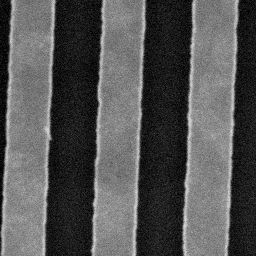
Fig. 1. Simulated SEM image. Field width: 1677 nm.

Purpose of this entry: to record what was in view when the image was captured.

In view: lines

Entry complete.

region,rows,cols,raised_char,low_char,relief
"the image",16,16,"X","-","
-XX---XXX---XXX-
-XX---XXX---XXX-
-XX---XXX---XXX-
-XX---XXX---XXX-
-XX---XXX---XXX-
-XX---XXX---XXX-
XXX---XXX---XXX-
XXX---XXX---XXX-
XXX---XXX---XXX-
XXX---XXX---XX--
XXX---XXX---XX--
XXX---XXX---XX--
XXX---XXX---XX--
XXX---XXX---XX--
XXX---XX---XXX--
XXX---XX---XXX--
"